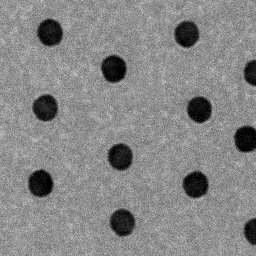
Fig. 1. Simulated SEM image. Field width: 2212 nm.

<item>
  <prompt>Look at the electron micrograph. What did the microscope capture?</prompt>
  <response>a regular array of holes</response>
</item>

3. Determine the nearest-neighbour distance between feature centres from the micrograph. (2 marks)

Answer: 649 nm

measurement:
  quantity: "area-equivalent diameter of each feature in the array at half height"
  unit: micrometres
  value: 0.242